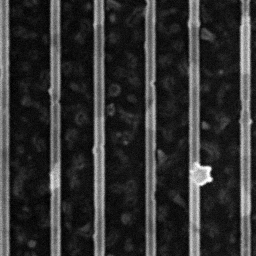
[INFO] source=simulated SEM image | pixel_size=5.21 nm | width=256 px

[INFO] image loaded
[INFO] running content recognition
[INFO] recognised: parallel lines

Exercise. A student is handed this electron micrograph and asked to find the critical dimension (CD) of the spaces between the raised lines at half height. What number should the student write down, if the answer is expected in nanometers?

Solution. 226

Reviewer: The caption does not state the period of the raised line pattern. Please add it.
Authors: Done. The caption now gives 248 nm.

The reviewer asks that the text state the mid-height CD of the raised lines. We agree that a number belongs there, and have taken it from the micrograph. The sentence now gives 0.0391 microns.